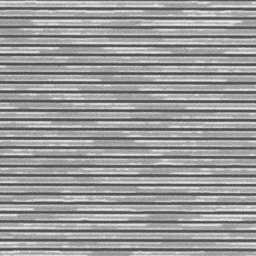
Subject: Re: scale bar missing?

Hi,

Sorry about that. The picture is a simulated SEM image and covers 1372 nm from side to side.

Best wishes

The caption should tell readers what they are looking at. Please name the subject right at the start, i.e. parallel lines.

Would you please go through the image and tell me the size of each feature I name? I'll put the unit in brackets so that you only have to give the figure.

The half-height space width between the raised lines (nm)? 18.1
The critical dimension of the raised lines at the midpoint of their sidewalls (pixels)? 5.88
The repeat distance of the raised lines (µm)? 0.0496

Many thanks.